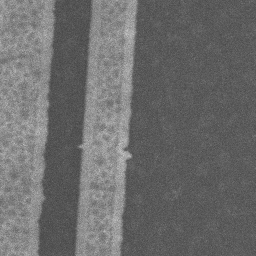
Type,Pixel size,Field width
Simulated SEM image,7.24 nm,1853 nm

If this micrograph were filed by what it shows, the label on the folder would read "one or a few lines or trenches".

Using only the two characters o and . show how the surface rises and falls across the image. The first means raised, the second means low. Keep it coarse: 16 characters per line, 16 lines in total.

ooo...oo........
ooo...oo........
ooo...oo........
ooo...oo........
ooo...oo........
ooo...oo........
ooo...oo........
ooo...oo........
ooo...oo........
oo....oo........
oo...ooo........
oo...oo.........
oo...oo.........
oo...oo.........
oo...oo.........
oo...oo.........